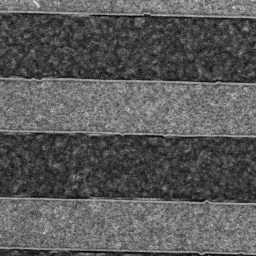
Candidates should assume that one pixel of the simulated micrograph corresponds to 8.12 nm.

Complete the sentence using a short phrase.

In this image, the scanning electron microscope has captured one or a few lines or trenches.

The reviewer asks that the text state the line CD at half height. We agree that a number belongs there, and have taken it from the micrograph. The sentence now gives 405 nm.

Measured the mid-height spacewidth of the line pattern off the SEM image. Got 546 nm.